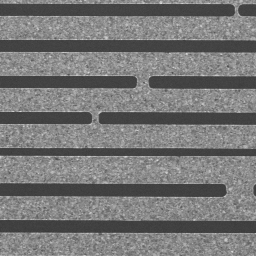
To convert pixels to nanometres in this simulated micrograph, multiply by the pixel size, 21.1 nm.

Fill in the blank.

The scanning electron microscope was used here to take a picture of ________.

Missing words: parallel lines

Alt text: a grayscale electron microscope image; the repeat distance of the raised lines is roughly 759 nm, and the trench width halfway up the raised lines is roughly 12.9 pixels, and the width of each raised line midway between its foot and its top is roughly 23.4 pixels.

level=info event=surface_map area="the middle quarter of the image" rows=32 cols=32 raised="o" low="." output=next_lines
oooooooooooooooooooooooooooooooo
oooooooooooooooooooooooooooooooo
oooooooooooooooooooooooooooooooo
..................ooo...........
..................ooo...........
..................ooo...........
oooooooooooooooooooooooooooooooo
oooooooooooooooooooooooooooooooo
oooooooooooooooooooooooooooooooo
oooooooooooooooooooooooooooooooo
oooooooooooooooooooooooooooooooo
oooooooooooooooooooooooooooooooo
.......oo.......................
.......o........................
.......oo.......................
oooooooooooooooooooooooooooooooo
oooooooooooooooooooooooooooooooo
oooooooooooooooooooooooooooooooo
oooooooooooooooooooooooooooooooo
oooooooooooooooooooooooooooooooo
oooooooooooooooooooooooooooooooo
................................
................................
oooooooooooooooooooooooooooooooo
oooooooooooooooooooooooooooooooo
oooooooooooooooooooooooooooooooo
oooooooooooooooooooooooooooooooo
oooooooooooooooooooooooooooooooo
oooooooooooooooooooooooooooooooo
oooooooooooooooooooooooooooooooo
................................
................................